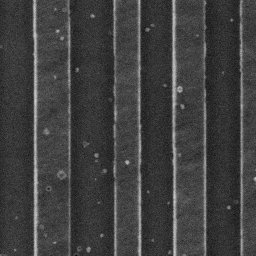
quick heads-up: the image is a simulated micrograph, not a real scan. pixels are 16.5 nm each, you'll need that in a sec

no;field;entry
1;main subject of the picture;lines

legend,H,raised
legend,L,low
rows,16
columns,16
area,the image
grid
LLHHLLLHHLLHHLLH
LLHHLLLHHLLHHLLH
LLHHLLLHHLLHHLLH
LLHHLLLHHLLHHLLH
LLHHLLLHHLLHHLLH
LLHHLLLHHLLHHLLH
LLHHLLLHHLLHHLLH
LLHHLLLHHLLHHLLH
LLHHLLLHHLLHHLLH
LLHHLLLHHLLHHLLH
LLHHLLLHHLLHHLLH
LLHHLLLHHLLHHLLH
LLHHLLLHHLLHHLLH
LLHHLLLHHLLHHLLH
LLHHLLLHHLLHHLLH
LLHHLLLHHLLHHLLH